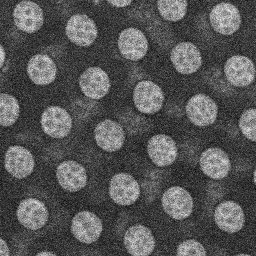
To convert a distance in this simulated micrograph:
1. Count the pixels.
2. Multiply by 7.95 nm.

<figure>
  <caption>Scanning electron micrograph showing a regular array of raised bodies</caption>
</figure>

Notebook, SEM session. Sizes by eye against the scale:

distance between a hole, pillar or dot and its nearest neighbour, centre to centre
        431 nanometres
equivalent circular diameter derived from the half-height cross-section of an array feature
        239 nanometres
